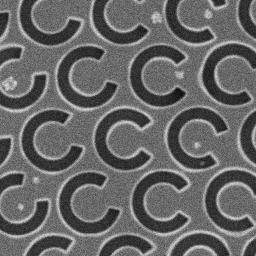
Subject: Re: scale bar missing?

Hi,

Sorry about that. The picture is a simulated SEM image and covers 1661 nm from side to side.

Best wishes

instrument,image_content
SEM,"an array of small figures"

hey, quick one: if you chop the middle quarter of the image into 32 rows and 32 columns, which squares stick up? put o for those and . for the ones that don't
..ooooooooooooooo...oooooooooooo
..oooooooooooooo....oooooooooooo
.ooooooooooooooo....oooooooooooo
.ooooooooooooooo....oooooooooooo
..ooooooooo.ooooo...oooooooooooo
..oooooooo....ooo...oooooooooooo
...ooooooo...oooo....oooooo...oo
.....ooo.....ooooo.....oo......o
............ooooooo...........oo
o..........ooooooooo........oooo
ooo......ooooooooooooo....oooooo
oooooooooooo......oooooooooooo..
.oooooooooo.........ooooooooo...
.ooooooooo...........ooooooo....
ooooooooo.....oo......ooooo....o
oooooooo....oooooo...ooooo....oo
oooooooo....oooooooooooooo...ooo
oooooooo...ooooooooooooooo...ooo
ooooooo....oooooooooooooo....ooo
ooooooo....ooooooooooooooo...ooo
oo.ooooo...ooooooooooooooo...ooo
o....ooo...oooooooo.oooooo....oo
o...ooooo...oooooo...oooooo....o
....ooooo.............ooooo.....
...ooooooo...........ooooooo....
..ooooooooo.........ooooooooo...
oooooooooooooo...ooooooooooooooo
oooo.....oooooooooooo........ooo
oo.........ooooooooo..........oo
o.........ooooooooo............o
.....ooo..oooooooo....ooooo....o
...ooooooooooooooo...ooooooo.ooo